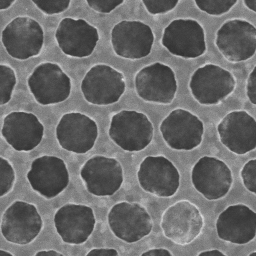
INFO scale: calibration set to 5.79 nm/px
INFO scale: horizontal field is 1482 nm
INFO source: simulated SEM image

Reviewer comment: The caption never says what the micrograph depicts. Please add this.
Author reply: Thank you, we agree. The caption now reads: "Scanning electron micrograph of a regular array of holes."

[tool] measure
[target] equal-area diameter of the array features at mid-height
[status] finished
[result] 238 nanometres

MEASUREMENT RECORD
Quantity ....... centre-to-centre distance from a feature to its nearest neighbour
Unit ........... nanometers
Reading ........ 304